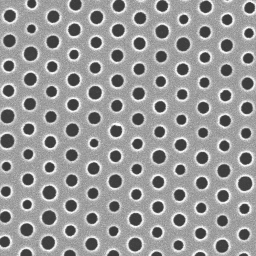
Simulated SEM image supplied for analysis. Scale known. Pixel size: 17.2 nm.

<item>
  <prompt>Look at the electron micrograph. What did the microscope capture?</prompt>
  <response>a regular array of holes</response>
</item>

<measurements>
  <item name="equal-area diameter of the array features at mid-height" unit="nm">210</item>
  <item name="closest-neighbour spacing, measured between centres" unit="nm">426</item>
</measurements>